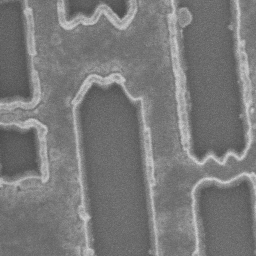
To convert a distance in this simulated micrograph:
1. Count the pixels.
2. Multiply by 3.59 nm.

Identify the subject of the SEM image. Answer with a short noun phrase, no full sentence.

one or a few lines or trenches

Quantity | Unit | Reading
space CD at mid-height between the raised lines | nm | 221